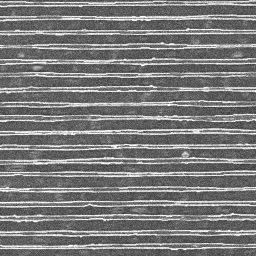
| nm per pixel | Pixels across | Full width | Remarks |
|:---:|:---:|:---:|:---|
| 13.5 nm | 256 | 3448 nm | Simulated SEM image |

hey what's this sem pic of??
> parallel lines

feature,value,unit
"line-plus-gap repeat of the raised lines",192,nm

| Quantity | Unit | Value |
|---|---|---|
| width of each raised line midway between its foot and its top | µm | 0.0522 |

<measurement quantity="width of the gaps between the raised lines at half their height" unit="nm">140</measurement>